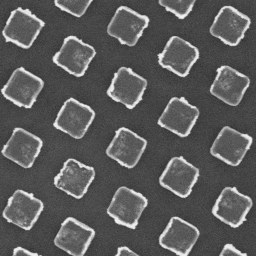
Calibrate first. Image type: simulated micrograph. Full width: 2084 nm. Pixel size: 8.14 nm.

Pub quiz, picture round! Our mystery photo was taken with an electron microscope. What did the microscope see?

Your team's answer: a regular array of raised bodies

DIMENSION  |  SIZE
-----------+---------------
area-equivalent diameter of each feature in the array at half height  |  0.3 µm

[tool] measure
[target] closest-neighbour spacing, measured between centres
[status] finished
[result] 0.484 µm